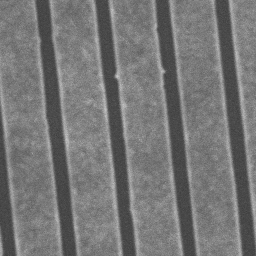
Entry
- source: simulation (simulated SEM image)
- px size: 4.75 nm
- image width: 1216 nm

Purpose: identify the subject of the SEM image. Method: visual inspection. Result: parallel lines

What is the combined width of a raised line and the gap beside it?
59.6 pixels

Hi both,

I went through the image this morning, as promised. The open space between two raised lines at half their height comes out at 73.2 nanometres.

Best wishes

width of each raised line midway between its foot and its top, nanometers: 211